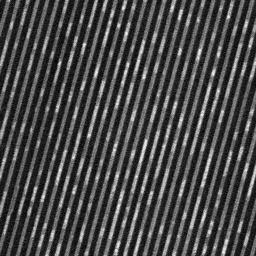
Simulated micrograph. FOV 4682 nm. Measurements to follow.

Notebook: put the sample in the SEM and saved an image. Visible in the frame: parallel lines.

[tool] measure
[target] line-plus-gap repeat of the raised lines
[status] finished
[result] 172 nanometers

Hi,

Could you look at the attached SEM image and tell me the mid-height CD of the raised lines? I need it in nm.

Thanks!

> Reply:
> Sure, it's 46.4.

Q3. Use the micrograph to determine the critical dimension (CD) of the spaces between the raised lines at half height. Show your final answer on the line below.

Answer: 126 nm